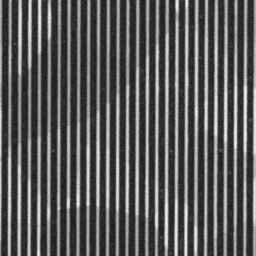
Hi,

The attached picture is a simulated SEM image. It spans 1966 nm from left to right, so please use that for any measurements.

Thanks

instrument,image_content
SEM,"parallel lines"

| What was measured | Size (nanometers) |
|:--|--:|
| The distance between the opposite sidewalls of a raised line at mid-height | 15.4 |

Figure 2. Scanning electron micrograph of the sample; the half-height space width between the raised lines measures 57.6 nm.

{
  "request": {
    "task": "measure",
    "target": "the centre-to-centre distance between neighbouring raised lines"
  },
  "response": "75.4 nm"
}